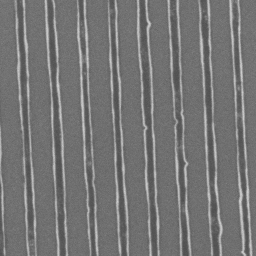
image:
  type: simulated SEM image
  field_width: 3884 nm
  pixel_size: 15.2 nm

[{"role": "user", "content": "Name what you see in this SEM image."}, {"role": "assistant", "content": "parallel lines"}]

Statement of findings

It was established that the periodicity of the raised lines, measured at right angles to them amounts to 464 nm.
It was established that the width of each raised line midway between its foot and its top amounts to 123 nanometers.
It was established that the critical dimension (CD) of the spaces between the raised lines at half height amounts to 0.339 micrometres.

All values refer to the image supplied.